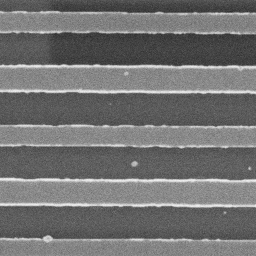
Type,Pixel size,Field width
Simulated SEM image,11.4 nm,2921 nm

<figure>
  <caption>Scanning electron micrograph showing lines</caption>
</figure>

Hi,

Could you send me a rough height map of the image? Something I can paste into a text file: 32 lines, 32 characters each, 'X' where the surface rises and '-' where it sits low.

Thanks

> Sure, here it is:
--------------------------------
XXXX-XXX------------------------
XXXXXXXXXXXXXXXXXXXXXXXXXXXXXXXX
XXXXXXXXXXXXXXXXXXXXXXXXXXXXXXXX
--------------------------------
--------------------------------
--------------------------------
--------------------------------
XXXXXXXXXXXXXXXXXXXXXXXXXXXXXXXX
XXXXXXXXXXXXXXXXXXXXXXXXXXXXXXXX
XXXXXXXXXXXXXXXXXXXXXXXXXXXXXXXX
---------X--XXX---XXXXXXXXXXXXXX
--------------------------------
--------------------------------
--------------------------------
--------------------------------
XXXXXXXXXXXXXXXXXXXXXXXXXXXXXXXX
XXXXXXXXXXXXXXXXXXXXXXXXXXXXXXXX
--------------------------------
--------------------------------
--------------------------------
--------------------------------
XXX-----------------------------
XXXXXXXXXXXXXXXXXXXXXXXXXXXXXXXX
XXXXXXXXXXXXXXXXXXXXXXXXXXXXXXXX
XXXXXXXXXXXXXXXXXXXXXXXXXXXXXXXX
--------------------------------
--------------------------------
--------------------------------
--------------------------------
XXXXXXXXXXXXXXXXXXXXXXXXXXXXXXXX
XXXXXXXXXXXXXXXXXXXXXXXXXXXXXXXX